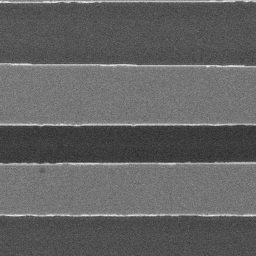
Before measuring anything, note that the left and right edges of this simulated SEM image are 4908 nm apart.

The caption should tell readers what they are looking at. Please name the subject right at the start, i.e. lines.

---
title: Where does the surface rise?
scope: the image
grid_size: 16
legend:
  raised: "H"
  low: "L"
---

LLLLLLLLLLLLLLLL
LLLLLLLLLLLLLLLL
LLLLLLLLLLLLLLLL
LLLLLLLLLLLLLLLL
HHHHHHHHHHHHHHHH
HHHHHHHHHHHHHHHH
HHHHHHHHHHHHHHHH
HHHHHHHHHHHHHHHH
LLLLLLLLLLLLLLLL
LLLLLLLLLLLLLLLL
HHHHHHHHHHHHHHHH
HHHHHHHHHHHHHHHH
HHHHHHHHHHHHHHHH
LLLLLLLLLLLLLLLL
LLLLLLLLLLLLLLLL
LLLLLLLLLLLLLLLL